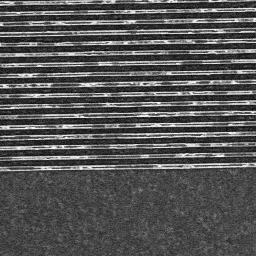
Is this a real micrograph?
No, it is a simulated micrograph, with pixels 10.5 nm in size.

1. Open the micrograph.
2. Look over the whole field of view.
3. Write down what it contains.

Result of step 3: parallel lines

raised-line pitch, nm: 108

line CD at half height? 35.4 nm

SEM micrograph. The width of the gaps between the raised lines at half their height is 6.75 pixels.